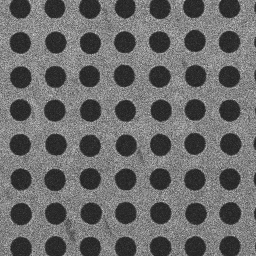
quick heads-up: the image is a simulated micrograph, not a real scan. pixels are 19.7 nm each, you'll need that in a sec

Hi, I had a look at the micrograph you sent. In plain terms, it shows a regular array of holes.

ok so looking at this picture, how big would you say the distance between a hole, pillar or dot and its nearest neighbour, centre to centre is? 33.8 px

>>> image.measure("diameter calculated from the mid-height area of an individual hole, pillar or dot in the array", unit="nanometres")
436